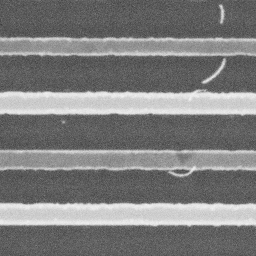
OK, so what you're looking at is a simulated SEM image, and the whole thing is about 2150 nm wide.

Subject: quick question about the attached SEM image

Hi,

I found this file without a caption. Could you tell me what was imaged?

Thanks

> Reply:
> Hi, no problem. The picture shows lines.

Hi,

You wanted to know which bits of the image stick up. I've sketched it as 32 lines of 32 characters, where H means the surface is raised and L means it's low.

LLLLLLLLLLLLLLLLLLLLLLLLLLLLLLLL
LLLLLLLLLLLLLLLLLLLLLLLLLLLLLLLL
LLLLLLLLLLLLLLLLLLLLLLLLLLLLLLLL
LLLLLLLLLLLLLLLLLLLLLLLLLLLLLLLL
LLLLLLLLLLLLLLLLLLLLLLLLLLLLLLLL
HHHHHHHHHHHHHHHHHHHHHHHHHHHHHHHH
HHHHHHHHHHHHHHHHHHHHHHHHHHHHHHHH
LLLLLLLLLLLLLLLLLLLLLLLLLLLLLLLL
LLLLLLLLLLLLLLLLLLLLLLLLLLLLLLLL
LLLLLLLLLLLLLLLLLLLLLLLLLLLLLLLL
LLLLLLLLLLLLLLLLLLLLLLLLLLLLLLLL
LLLLLLLLLLLLLLLLLLLLLLLLLLLLLLLL
HHHHHHHHHHHHHHHHHHHHHHHHHHHHHHHH
HHHHHHHHHHHHHHHHHHHHHHHHHHHHHHHH
LLLLLLLLLLLLLLLLLLLLLLLLLLLLLLLL
LLLLLLLLLLLLLLLLLLLLLLLLLLLLLLLL
LLLLLLLLLLLLLLLLLLLLLLLLLLLLLLLL
LLLLLLLLLLLLLLLLLLLLLLLLLLLLLLLL
LLLLLLLLLLLLLLLLLLLLLLLLLLLLLLLL
HHHHHHHHHHHHHHHHHHHHHHHHHHHHHHHH
HHHHHHHHHHHHHHHHHHHHHHHHHHHHHHHH
LLLLLLLLLLLLLLLLLLLLLLLLLLLLLLLL
LLLLLLLLLLLLLLLLLLLLLLLLLLLLLLLL
LLLLLLLLLLLLLLLLLLLLLLLLLLLLLLLL
LLLLLLLLLLLLLLLLLLLLLLLLLLLLLLLL
LLLLLLLLLLLLLLLLLLLLLLLLLLLLLLLL
HHHHHHHHHHHHHHHHHHHHHHHHHHHHHHHH
HHHHHHHHHHHHHHHHHHHHHHHHHHHHHHHH
LLLLLLLLLLLLLLLLLLLLLLLLLLLLLLLL
LLLLLLLLLLLLLLLLLLLLLLLLLLLLLLLL
LLLLLLLLLLLLLLLLLLLLLLLLLLLLLLLL
LLLLLLLLLLLLLLLLLLLLLLLLLLLLLLLL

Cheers